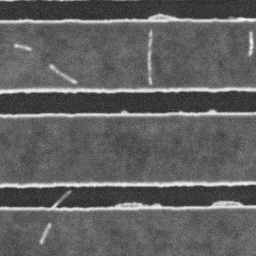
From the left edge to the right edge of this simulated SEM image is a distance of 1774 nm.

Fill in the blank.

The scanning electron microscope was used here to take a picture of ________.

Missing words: lines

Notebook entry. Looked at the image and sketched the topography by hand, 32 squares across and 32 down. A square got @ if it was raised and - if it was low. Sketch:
--------------------------------
--------------------------------
---------------------@@-------@@
@@@@@@@@@@@@@@@@@@@@@@@@@@@@@@@@
@@@@@@@@@@@@@@@@@@@@@@@@@@@@@@@@
@@@@@@@@@@@@@@@@@@@@@@@@@@@@@@@@
@@@@@@@@@@@@@@@@@@@@@@@@@@@@@@@@
@@@@@@@@@@@@@@@@@@@@@@@@@@@@@@@@
@@@@@@@@@@@@@@@@@@@@@@@@@@@@@@@@
@@@@@@@@@@@@@@@@@@@@@@@@@@@@@@@@
@@@@@@@@@@@@@@@@@@@@@@@@@@@@@@@@
@@----------@-------------------
--------------------------------
--------------------------------
@@@@@@@@@@@@@@@@@@@@@@@@@@@@@@@@
@@@@@@@@@@@@@@@@@@@@@@@@@@@@@@@@
@@@@@@@@@@@@@@@@@@@@@@@@@@@@@@@@
@@@@@@@@@@@@@@@@@@@@@@@@@@@@@@@@
@@@@@@@@@@@@@@@@@@@@@@@@@@@@@@@@
@@@@@@@@@@@@@@@@@@@@@@@@@@@@@@@@
@@@@@@@@@@@@@@@@@@@@@@@@@@@@@@@@
@@@@@@@@@@@@@@@@@@@@@@@@@@@@@@@@
@@@@@@@@@@@@@@@@@@@@@@@@@@@@@@@@
--------------------------------
--------------------------------
--------------------------------
@@@@@@@@@@@@@@@@@@@@@@@@@@@@@@@@
@@@@@@@@@@@@@@@@@@@@@@@@@@@@@@@@
@@@@@@@@@@@@@@@@@@@@@@@@@@@@@@@@
@@@@@@@@@@@@@@@@@@@@@@@@@@@@@@@@
@@@@@@@@@@@@@@@@@@@@@@@@@@@@@@@@
@@@@@@@@@@@@@@@@@@@@@@@@@@@@@@@@